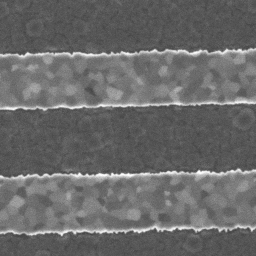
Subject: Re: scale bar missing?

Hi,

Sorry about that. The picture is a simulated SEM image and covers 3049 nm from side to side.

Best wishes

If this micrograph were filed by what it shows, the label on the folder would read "one or a few lines or trenches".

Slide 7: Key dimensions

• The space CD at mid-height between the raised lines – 800 nm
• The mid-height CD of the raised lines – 664 nanometers